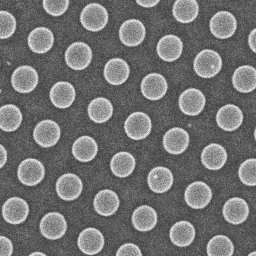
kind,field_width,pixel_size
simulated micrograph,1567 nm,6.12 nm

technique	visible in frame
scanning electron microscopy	a regular array of raised bodies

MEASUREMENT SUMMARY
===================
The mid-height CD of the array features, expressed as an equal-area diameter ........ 154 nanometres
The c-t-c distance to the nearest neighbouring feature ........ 249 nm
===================